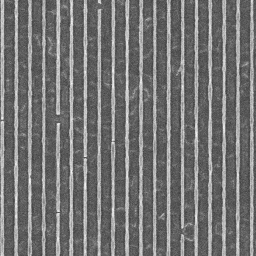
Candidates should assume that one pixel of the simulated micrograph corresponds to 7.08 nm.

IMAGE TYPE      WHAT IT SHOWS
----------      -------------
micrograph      parallel lines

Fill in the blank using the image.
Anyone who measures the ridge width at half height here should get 19.5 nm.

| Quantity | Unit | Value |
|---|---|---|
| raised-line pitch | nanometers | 98.2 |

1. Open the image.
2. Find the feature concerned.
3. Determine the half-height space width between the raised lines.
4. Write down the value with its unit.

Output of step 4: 77.9 nm